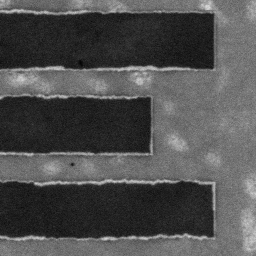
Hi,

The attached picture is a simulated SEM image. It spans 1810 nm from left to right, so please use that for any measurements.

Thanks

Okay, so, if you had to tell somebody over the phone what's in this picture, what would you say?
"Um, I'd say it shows one or a few lines or trenches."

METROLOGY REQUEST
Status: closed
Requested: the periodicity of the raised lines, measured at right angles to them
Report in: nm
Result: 599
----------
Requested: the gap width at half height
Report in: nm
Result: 187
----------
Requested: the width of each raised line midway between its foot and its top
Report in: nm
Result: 410